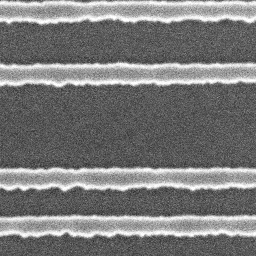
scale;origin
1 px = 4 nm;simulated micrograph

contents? lines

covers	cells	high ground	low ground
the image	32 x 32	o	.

oooooooooo.ooooooooooooooooooooo
oooooooooooooooooooooooooooooooo
oooooooooo.....oo..oooo..oo...oo
................................
................................
................................
................................
................................
oooooooooooooooooooooooooooooooo
oooooooooooooooooooooooooooooooo
ooo....o........................
................................
................................
................................
................................
................................
................................
................................
................................
................................
................................
oooooooooooooooooooooooooooooooo
oooooooooooooooooooooooooooooooo
.o.oo...o...o.oo........o.o.....
................................
................................
................................
oooooooooooooooooooooooooooooooo
oooooooooooooooooooooooooooooooo
..........o.....................
................................
................................